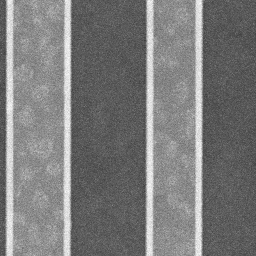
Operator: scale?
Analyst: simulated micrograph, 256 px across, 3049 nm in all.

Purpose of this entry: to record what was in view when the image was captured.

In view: one or a few lines or trenches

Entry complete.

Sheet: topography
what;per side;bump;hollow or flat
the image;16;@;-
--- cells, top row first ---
-@@@-----@@@----
-@@@-----@@@----
-@@@-----@@@----
-@@@-----@@@----
-@@@-----@@@----
-@@@-----@@@----
-@@@-----@@@----
-@@@-----@@@----
-@@@-----@@@----
-@@@-----@@@----
-@@@-----@@@----
-@@@-----@@@----
-@@@-----@@@----
-@@@-----@@@----
-@@@-----@@@----
-@@@-----@@@----